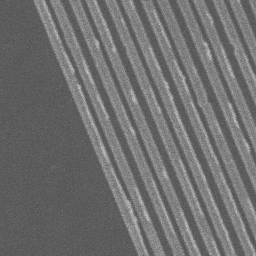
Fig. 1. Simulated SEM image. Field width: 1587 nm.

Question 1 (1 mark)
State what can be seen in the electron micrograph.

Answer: parallel lines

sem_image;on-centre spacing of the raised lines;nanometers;102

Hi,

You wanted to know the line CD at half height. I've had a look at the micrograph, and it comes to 55.2 nanometers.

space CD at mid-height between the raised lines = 38.8 nm